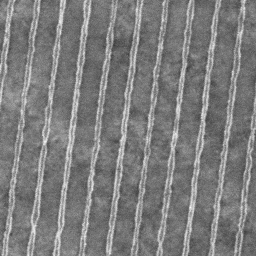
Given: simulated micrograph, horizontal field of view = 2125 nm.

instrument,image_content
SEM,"parallel lines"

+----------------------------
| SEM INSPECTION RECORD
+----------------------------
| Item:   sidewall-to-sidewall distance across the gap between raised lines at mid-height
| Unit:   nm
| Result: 183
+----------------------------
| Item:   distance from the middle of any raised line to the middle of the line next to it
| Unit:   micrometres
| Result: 0.213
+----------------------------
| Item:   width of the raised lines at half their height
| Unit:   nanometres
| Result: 30.8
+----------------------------